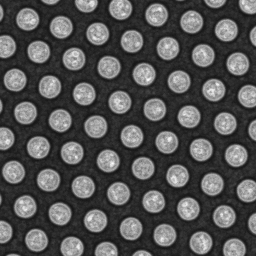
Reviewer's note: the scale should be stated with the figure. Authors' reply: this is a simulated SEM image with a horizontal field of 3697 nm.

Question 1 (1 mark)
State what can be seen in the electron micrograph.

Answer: a regular array of raised bodies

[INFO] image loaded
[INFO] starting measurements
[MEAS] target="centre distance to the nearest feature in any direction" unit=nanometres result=497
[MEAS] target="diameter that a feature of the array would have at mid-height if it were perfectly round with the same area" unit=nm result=323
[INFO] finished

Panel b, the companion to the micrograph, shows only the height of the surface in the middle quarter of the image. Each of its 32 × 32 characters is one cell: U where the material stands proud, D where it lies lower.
UUUUUDDDDUUUUUDDDDUUUUDDDDDDDDDD
DDDDDDDDDUUUUUDDDUUUUUDDDDDDDDDD
DDDDDDDDDUUUUDDDDUUUUUUDDDDUUUUD
DDDDDDDDDDDUDDDDDDUUUUUDDDUUUUUD
DDDDDDDDDDDDDDDDDDUUUUDDDDUUUUUU
DDDUUUUDDDDDDDDDDDDDDDDDDDUUUUUD
DDDUUUUUDDDDDDDDDDDDDDDDDDDUUUUD
DDUUUUUUDDDDUUUUDDDDDDDDDDDDDDDD
DDDUUUUUDDDUUUUUDDDDDDDDDDDDDDDD
DDDUUUUDDDDUUUUUUDDDDUUUUDDDDDDD
DDDDDDDDDDDUUUUUUDDDUUUUUDDDDDDU
DDDDDDDDDDDDUUUUDDDDUUUUUDDDDUUU
UDDDDDDDDDDDDDDDDDDDUUUUUDDDDUUU
UUDDDDUUUUDDDDDDDDDDDUUUDDDDUUUU
UUDDDUUUUUDDDDDDDDDDDDDDDDDDDUUU
UUDDDUUUUUUDDDDDUUDDDDDDDDDDDDUU
UDDDDUUUUUUDDDDUUUUDDDDDDDDDDDDD
DDDDDDUUUUDDDDUUUUUUDDDDUUUDDDDD
DDDDDDDDDDDDDDUUUUUUDDDUUUUUDDDD
DDDDDDDDDDDDDDDUUUUDDDDUUUUUDDDD
UUUUDDDDDDDDDDDDUUUDDDDUUUUUDDDD
UUUUUDDDDDUDDDDDDDDDDDDDUUUUDDDD
UUUUUDDDDUUUUDDDDDDDDDDDDDDDDDDD
UUUUDDDDUUUUUUDDDDDUUDDDDDDDDDDD
DUUUDDDDUUUUUUDDDUUUUUDDDDDDDDDD
DDDDDDDDDUUUUUDDDUUUUUDDDDDUUUDD
DDDDDDDDDUUUDDDDDUUUUUUDDDUUUUUD
DDDDDDDDDDDDDDDDDUUUUUDDDDUUUUUD
DDDUUUDDDDDDDDDDDDDUUDDDDDUUUUUD
DDUUUUUDDDDDDDDDDDDDDDDDDDUUUUUD
DDUUUUUUDDDDUUUUDDDDDDDDDDDUUUDD
DDUUUUUUDDDUUUUUDDDDDDDDDDDDDDDD